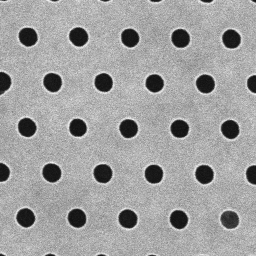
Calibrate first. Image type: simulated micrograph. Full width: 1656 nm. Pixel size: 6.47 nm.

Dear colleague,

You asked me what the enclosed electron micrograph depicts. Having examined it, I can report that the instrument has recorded a regular array of holes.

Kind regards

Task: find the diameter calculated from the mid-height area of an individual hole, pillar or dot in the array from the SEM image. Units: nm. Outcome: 123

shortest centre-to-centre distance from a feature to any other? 328 nanometres